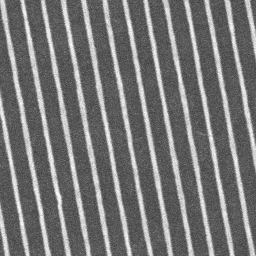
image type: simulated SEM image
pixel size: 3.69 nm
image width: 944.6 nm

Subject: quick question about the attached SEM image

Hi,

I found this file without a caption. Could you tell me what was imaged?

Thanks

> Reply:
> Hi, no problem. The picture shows parallel lines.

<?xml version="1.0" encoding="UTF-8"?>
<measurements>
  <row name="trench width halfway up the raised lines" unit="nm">62.6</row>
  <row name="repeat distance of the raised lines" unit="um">0.0743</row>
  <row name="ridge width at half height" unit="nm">12.2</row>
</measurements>